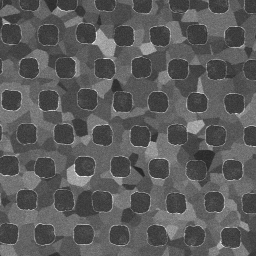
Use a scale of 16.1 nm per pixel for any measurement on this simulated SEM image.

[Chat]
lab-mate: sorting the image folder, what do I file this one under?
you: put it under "a regular array of holes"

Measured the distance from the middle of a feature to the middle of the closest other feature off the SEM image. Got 590 nm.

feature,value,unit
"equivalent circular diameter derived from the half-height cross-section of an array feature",348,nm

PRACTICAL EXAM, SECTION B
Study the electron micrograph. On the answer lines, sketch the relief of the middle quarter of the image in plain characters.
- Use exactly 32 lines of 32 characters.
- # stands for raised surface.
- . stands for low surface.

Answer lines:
...#####.....####.....####.....#
...#####.....####.....####.....#
...#####.....####.....####.....#
..#######...######..#######...##
################################
################################
####....########################
###.....####.....#####...#######
###.....####.....####.....#####.
###......###.....####.....#####.
####....####.....####.....#####.
######.######....####.....#####.
################################
################################
################################
..######...#######.#######....##
..#####.....#####....#####.....#
...####.....####......####.....#
...####.....#####.....####.....#
..#####.....#####....#####....##
##########.#######...###########
################################
################################
###....#####....################
###.....####....#####.....#####.
###.....####.....####.....#####.
###.....####.....####.....####..
###....#####....#####.....#####.
######################...######.
################################
################################
.###############################